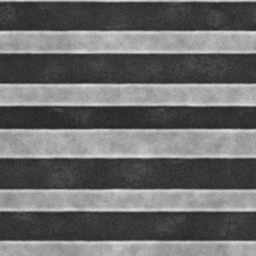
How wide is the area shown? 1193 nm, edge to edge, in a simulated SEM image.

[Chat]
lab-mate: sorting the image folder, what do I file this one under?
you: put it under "parallel lines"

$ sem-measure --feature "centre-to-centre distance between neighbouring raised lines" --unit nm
246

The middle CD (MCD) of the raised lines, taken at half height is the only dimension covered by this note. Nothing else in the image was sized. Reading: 0.102 um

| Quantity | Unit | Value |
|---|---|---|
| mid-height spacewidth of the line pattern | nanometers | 138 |